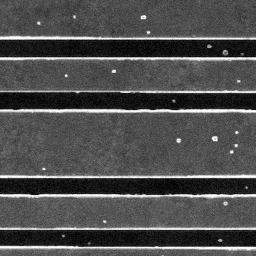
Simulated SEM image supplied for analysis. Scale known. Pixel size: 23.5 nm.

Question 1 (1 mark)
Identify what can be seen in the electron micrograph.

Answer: lines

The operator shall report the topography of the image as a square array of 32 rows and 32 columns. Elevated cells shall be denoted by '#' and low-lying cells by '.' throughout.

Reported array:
################################
################################
################################
################################
################################
................................
................................
################################
################################
################################
################################
...............#################
................................
................................
################################
################################
################################
################################
################################
################################
################################
################################
................................
................................
################################
################################
################################
################################
################################
................................
................................
################################